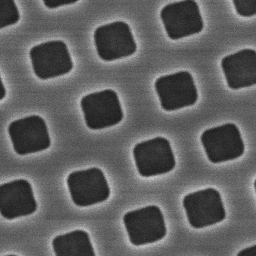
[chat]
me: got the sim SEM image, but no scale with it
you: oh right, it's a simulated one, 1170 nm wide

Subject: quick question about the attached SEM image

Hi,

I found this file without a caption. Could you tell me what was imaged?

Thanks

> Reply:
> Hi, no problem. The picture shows a regular array of holes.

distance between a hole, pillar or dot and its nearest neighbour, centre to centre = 0.311 um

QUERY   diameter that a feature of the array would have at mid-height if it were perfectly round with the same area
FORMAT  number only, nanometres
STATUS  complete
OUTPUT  189